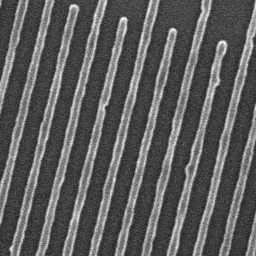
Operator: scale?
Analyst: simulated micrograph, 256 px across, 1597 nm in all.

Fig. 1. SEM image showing parallel lines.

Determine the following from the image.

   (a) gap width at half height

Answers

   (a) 112 nm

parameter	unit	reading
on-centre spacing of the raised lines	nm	159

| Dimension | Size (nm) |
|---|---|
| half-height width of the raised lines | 47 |